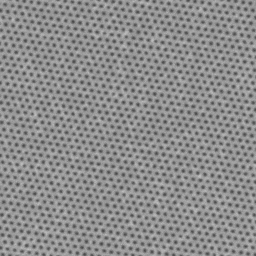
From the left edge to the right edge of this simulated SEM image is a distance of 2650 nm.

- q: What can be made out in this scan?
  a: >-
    a regular array of holes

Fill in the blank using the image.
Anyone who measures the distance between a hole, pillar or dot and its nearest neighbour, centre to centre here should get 73.3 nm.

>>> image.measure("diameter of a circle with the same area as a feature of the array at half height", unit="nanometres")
45.2